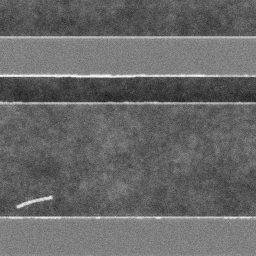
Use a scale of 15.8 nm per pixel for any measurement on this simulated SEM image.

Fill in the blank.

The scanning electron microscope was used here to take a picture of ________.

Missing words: lines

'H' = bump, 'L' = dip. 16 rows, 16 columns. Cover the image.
LLLLLLLLLLLLLLLL
LLLLLLLLLLLLLLLL
HHHHHHHHHHHHHHHH
HHHHHHHHHHHHHHHH
HHHHHHHHHHHHHHHH
LLLLLLLLLLLLLLLL
LLLLLLLLLLLLLLLL
LLLLLLLLLLLLLLLL
LLLLLLLLLLLLLLLL
LLLLLLLLLLLLLLLL
LLLLLLLLLLLLLLLL
LLLLLLLLLLLLLLLL
LLLLLLLLLLLLLLLL
LLLLLLLLLLLLLLLL
HHHHHHHHHHHHHHHH
HHHHHHHHHHHHHHHH